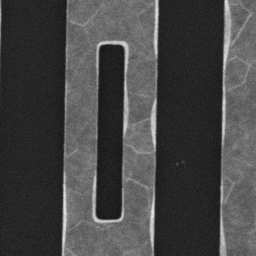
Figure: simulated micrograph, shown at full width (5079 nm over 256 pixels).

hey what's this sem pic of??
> groups of lines, slits or small figures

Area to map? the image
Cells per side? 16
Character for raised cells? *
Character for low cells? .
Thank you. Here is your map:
....******....**
....******....**
....******....**
....**..**....**
....**..**....**
....**..**....**
....**..**....**
....**..**....**
....**..**....**
....**..**....**
....**..**....**
....**..**....**
....**..**....**
....**..**....**
....*****.....**
....******....**